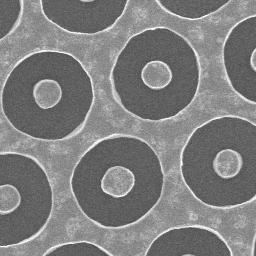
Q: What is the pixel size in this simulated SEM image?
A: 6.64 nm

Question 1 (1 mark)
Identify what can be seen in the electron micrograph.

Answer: ring-shaped grooves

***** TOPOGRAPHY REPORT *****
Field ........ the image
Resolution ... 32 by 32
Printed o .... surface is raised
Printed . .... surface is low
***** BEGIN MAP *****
...oo...........oooo........oooo
...oo..........oooooo......ooooo
..oooo.........oooooooooooooooo.
..oooooo......ooooooooooooooo...
.oooooooooooooooo......ooooo....
oooooooooooooooo........oooo....
ooooo..oooooooo.........oooo....
ooo.......ooooo..........ooo...o
oo........oooo....ooo....ooo....
o..........ooo....ooo....oooo...
o....oo....ooo....ooo....oooo...
....oooo....oo..........oooooo..
....ooo.....ooo.........ooooooo.
.....o.....ooooo.......ooooooooo
o..........oooooo.....oooooooooo
o.........oooooooooooooooo......
ooo.......oooooooooooooo........
ooooooooooooo.....oooooo........
oooooooooooo.......oooo.........
...ooooooo..........ooo....ooo..
.....ooooo..........ooo....ooo..
......ooo....ooo....ooo....ooo..
......ooo....oooo...ooo.........
oo....ooo....ooo....oooo........
oo.....oo.....o.....oooo........
oo....oooo.........ooooooo....oo
o.....oooo........oooooooooooooo
......oooooo.....ooooooooooooooo
.....oooooooooooooooooo..ooooooo
....oooooooooooooooo.......ooooo
..ooooooo..oooooooo.........oooo
oooooo.......ooooo...........ooo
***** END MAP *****